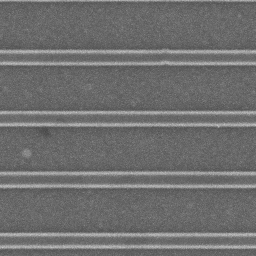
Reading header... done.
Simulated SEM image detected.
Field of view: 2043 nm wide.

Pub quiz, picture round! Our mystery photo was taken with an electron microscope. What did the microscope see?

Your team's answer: one or a few lines or trenches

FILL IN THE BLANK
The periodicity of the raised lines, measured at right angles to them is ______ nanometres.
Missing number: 487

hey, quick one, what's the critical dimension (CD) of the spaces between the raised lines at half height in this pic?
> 386 nanometres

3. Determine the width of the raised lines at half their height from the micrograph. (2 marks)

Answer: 105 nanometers